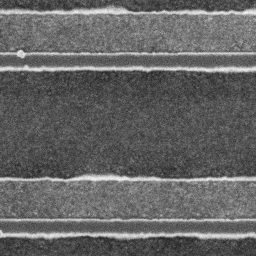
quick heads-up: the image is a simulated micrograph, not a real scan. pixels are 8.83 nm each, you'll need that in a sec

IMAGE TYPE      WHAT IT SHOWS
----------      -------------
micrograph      lines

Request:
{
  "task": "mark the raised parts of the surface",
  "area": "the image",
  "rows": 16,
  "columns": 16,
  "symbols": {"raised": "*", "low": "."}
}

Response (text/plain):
................
****************
****************
****************
................
................
................
................
................
................
................
****************
****************
****************
****************
................